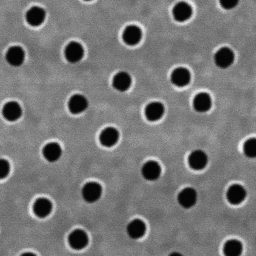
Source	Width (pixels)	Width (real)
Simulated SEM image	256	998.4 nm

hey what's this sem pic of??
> a regular array of holes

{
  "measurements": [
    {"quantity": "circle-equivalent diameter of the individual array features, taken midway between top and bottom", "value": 0.0783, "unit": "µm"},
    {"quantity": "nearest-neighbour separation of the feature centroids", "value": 46.7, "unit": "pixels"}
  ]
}